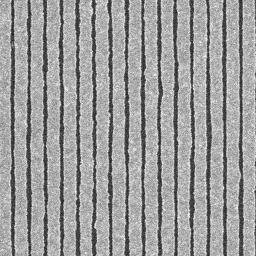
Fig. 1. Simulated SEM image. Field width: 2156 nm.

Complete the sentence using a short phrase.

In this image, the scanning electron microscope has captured parallel lines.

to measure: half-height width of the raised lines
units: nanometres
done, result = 101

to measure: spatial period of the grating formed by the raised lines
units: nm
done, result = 137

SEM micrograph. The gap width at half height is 35.8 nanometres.